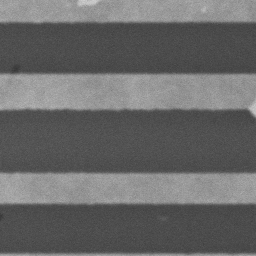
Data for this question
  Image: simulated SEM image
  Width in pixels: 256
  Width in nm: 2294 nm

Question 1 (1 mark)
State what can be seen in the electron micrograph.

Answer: lines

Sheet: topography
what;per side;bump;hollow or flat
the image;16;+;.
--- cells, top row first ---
++++++++++++++++
................
................
................
................
++++++++++++++++
++++++++++++++++
................
................
................
................
++++++++++++++++
++++++++++++++++
................
................
................